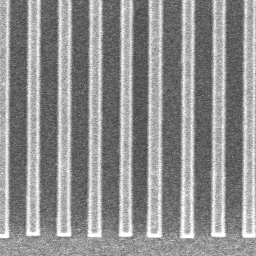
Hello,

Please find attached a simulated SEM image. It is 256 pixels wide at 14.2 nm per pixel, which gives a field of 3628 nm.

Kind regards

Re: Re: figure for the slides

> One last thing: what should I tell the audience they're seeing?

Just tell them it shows parallel lines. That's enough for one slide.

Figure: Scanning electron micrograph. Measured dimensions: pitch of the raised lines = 437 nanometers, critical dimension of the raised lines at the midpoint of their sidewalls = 0.163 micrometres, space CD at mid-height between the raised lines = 278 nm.